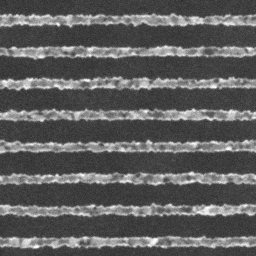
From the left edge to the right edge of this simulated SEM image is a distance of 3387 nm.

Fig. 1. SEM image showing parallel lines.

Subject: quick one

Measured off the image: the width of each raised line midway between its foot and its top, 106 nanometres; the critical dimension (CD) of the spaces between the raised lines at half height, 316 nanometres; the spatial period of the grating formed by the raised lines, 420 nm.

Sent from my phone